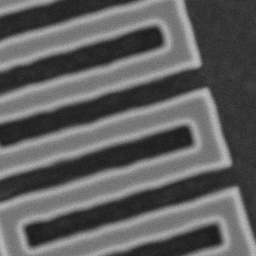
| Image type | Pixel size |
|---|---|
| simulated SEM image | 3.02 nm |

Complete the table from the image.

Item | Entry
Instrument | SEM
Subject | groups of lines, slits or small figures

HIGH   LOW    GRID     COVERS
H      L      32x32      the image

HHHHHLLLLLLLLLLLLHHHHHHLLLLLLLLL
HLLLLLLLLLLLLHHHHHHHHHHLLLLLLLLL
LLLLLLLLLHHHHHHHHHHHHHHLLLLLLLLL
LLLLLLHHHHHHHHHHHHLLHHHHLLLLLLLL
LLLHHHHHHHHHHHHLLLLLLHHHLLLLLLLL
HHHHHHHHHHHLLLLLLLLLLHHHLLLLLLLL
HHHHHHHLLLLLLLLLLLHHHHHHHLLLLLLL
HHHHLLLLLLLLLLLHHHHHHHHHHLLLLLLL
HLLLLLLLLLLLHHHHHHHHHHHLLLLLLLLL
LLLLLLLLHHHHHHHHHHHHLLLLLLLLLLLL
LLLLLHHHHHHHHHHHHLLLLLLLLLLLLLLL
LLHHHHHHHHHHHHLLLLLLLLLLHHLLLLLL
HHHHHHHHHHHLLLLLLLLLLHHHHHLLLLLL
HHHHHHHLLLLLLLLLLLHHHHHHHHHLLLLL
HHHLLLLLLLLLLLHHHHHHHHHHHHHLLLLL
LLLLLLLLLLLLHHHHHHHHHHHHHHHLLLLL
LLLLLLLLHHHHHHHHHHHHLLLLHHHLLLLL
LLLLHHHHHHHHHHHHLLLLLLLLHHHHLLLL
HHHHHHHHHHHHLLLLLLLLLLLLHHHHLLLL
HHHHHHHHHLLLLLLLLLLLHHHHHHHHLLLL
HHHHHHLLLLLLLLLLLHHHHHHHHHHHLLLL
HHLLLLLLLLLLLHHHHHHHHHHHHLLLLLLL
LLLLLLLLLLHHHHHHHHHHHHLLLLLLLLLL
LLLLLLLHHHHHHHHHHHHLLLLLLLLLLLLL
LLLHHHHHHHHHHHHLLLLLLLLLLLHHHHLL
HHHHHHHHHHHHLLLLLLLLLLLHHHHHHHLL
HHHHHHHHHLLLLLLLLLLLHHHHHHHHHHLL
HHHHHHLLLLLLLLLLLHHHHHHHHHHHHHHL
HHHLLLLLLLLLLHHHHHHHHHHHLLLLHHHL
HHHLLLLLLHHHHHHHHHHHHLLLLLLLHHHL
HHHLLLHHHHHHHHHHHLLLLLLLLLLLHHHH
HHHHHHHHHHHHHHLLLLLLLLLLLHHHHHHH